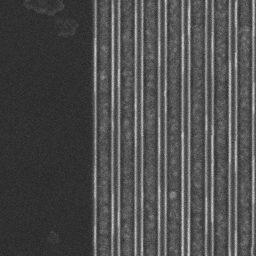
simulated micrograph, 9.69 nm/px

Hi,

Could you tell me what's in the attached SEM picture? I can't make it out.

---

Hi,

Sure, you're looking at parallel lines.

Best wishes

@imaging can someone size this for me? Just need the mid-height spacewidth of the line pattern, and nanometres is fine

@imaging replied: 158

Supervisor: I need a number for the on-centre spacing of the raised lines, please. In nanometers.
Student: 227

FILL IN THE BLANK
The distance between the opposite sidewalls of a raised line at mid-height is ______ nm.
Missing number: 70.3